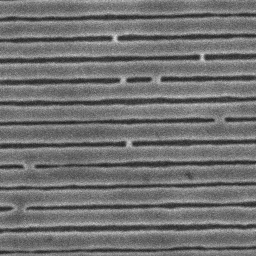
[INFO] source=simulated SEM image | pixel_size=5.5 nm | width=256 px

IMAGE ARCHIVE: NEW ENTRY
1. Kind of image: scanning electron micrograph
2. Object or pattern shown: parallel lines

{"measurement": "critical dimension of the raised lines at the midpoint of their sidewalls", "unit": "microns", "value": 0.0866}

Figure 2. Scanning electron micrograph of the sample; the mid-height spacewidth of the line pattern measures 0.0258 um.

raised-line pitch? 117 nm